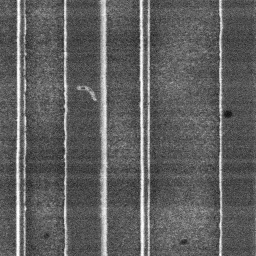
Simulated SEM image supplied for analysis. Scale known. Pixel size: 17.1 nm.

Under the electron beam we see lines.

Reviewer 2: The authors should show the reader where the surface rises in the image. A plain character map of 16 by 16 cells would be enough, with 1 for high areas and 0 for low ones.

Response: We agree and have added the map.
0000110000000011
0000111000000011
0000110000000011
0000111000000011
0000111000000011
0000111000000011
0000111000000011
0000111000000011
0000111000000011
0100111000000011
0000111000000011
0000111000000011
0000111000000011
0000111000000011
0000111000000011
0000111000000011